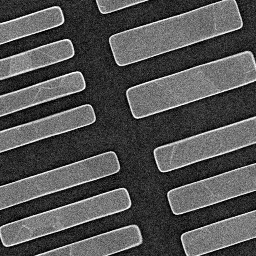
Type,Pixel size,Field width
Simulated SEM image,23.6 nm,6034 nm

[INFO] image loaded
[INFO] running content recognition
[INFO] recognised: groups of lines, slits or small figures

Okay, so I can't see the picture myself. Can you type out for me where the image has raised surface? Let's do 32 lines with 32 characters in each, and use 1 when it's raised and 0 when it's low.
00000000000011111000000000111100
00000111000001000000000011111100
00111111000000000000111111111100
11111100000000000111111111111100
11100000000000111111111111100000
00000011100000111111111100000000
00011111100000111111100000000000
11111111000000111100000000001111
11111000000000000000000011111111
10000000110000000000011111111111
00000111111000000011111111111110
00111111110000001111111111110000
11111100000000001111111110000000
11100000001000001111100000000000
00000001111100000100000000000000
00011111111000000000000000000111
11111111000000000000000000111111
11111000000000000000000111111111
11000000000000000000111111111100
00000000000011100001111111100000
00000000011111100000111100000000
00000011111111000000000000001111
00011111111100000000000001111111
11111111000000000000001111111111
11111000000011110000011111111100
11000000011111110000011111100000
00000011111111100000001000000001
00011111111000000000000000001111
11111111000000011000000001111111
11111000000011111100000111111111
01000000011111111000000111111000
00000011111111100000000111000000